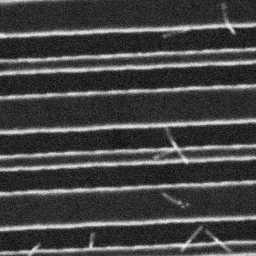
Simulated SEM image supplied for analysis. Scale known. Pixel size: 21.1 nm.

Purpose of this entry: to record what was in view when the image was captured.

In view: lines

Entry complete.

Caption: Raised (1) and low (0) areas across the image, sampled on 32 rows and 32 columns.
11111111111111111111111111111111
11111111111111111111111111111111
11111111111111111111111111111111
11111111111111111111111100000000
11100000000000000000000000000000
00000000000000000000000000000000
00000000000000000000000111111111
00111111111111111111111111111111
11111111111111111100000000000000
00000000000000000000000000000000
00000000000000000000000000000000
00000000000000111111111111111111
11111111111111111111111111111111
11111111111111111111111111111111
11111111111111111111111111111111
11111111111111111111111110000000
11110000000000000000000000000000
00000000000000000000000000000000
00000000000000000000011111111111
00111111111111111111111111111111
11111111111111111000000000000000
00000000000000000000000000000000
00000000000000000000000000000000
00000000000000011111111111111111
11111111111111111111111111111111
11111111111111111111111111111111
11111111111111111111111111111111
11111111111111111111111110000000
11110000000000000000000000000000
00000000000000000000000000000000
00000000000000000000000111111111
00111111111111111111111111111111